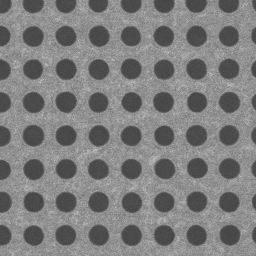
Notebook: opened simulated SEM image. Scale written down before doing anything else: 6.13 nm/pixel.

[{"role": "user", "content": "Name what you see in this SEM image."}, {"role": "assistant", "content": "a regular array of holes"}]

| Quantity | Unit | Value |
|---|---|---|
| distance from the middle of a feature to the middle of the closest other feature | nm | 198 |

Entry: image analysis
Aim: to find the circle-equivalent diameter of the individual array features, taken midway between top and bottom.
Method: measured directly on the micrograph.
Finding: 125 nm